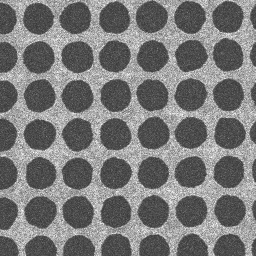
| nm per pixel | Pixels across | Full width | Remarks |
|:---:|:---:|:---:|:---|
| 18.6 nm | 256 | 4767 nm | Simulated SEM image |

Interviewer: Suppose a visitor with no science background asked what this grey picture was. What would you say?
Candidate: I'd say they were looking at a regular array of holes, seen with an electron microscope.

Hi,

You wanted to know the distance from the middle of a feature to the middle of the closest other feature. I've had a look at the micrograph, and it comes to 0.7 micrometres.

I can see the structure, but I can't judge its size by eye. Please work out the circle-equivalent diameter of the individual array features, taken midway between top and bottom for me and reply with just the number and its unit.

598 nm